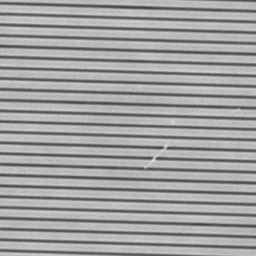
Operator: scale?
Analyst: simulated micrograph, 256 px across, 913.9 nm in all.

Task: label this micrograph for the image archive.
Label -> parallel lines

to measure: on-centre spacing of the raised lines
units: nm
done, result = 38.3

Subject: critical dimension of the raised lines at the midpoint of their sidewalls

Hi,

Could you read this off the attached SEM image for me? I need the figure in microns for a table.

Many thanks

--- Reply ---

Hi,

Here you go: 0.0272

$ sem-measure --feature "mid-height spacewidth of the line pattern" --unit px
3.36